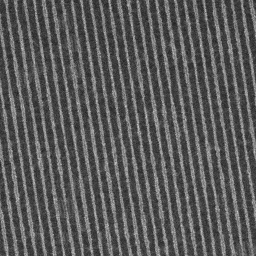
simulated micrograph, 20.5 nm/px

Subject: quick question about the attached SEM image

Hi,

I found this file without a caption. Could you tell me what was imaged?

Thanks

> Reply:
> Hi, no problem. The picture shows parallel lines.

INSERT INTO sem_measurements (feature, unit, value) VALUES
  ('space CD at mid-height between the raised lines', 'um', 0.152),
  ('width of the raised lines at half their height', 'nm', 40.5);